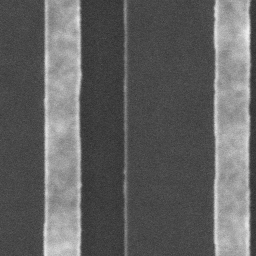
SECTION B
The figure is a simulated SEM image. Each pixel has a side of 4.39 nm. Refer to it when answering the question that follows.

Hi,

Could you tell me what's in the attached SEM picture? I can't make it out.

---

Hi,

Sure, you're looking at lines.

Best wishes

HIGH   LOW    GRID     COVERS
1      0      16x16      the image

1111100011111111
1111100011111111
1111100011111111
1111100011111111
1111100011111111
1111100011111111
1111100011111111
1111100011111111
1111100011111111
1111100011111111
1111100011111111
1111100011111111
1111100011111111
1111100011111111
1111100011111111
1111100011111111